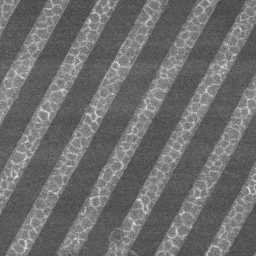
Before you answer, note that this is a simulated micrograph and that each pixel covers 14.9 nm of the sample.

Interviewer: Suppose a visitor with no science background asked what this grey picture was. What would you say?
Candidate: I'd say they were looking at parallel lines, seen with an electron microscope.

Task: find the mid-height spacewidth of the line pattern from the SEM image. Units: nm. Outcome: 274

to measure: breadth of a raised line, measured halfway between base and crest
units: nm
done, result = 378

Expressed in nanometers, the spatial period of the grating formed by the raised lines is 648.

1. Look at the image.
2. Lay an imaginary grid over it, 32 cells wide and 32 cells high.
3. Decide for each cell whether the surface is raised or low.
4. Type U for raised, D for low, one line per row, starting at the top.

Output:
DDUUUUDDUUUUDDDUUUDDDUUUDDDUUUUD
DDUUUDDDUUUDDDUUUUDDUUUUDDDUUUDD
DUUUUDDUUUUDDUUUUDDDUUUDDDUUUDDD
UUUUDDDUUUDDDUUUUDDUUUUDDUUUUDDD
UUUUDDUUUUDDUUUUDDDUUUDDDUUUDDDU
UUUDDDUUUDDDUUUDDDUUUUDDUUUUDDUU
UUDDDUUUUDDUUUUDDUUUUDDDUUUDDDUU
UUDDUUUUDDDUUUDDDUUUUDDUUUUDDUUU
UDDDUUUUDDUUUUDDUUUUDDDUUUDDDUUU
UDDUUUUDDDUUUDDDUUUDDDUUUUDDUUUU
DDDUUUDDDUUUUDDUUUUDDUUUUDDDUUUD
DDUUUUDDDUUUDDDUUUDDDUUUDDDUUUUD
DDUUUDDDUUUUDDUUUUDDUUUUDDDUUUDD
DUUUUDDUUUUDDUUUUDDDUUUDDDUUUUDD
DUUUDDDUUUDDDUUUUDDUUUUDDUUUUDDD
UUUUDDUUUUDDUUUUDDDUUUDDDUUUDDDU
UUUDDDUUUDDDUUUUDDUUUUDDUUUUDDDU
UUUDDUUUUDDUUUUDDDUUUDDDUUUDDDUU
UUDDDUUUDDDUUUDDDUUUUDDUUUUDDUUU
UDDDUUUUDDUUUUDDUUUUDDDUUUDDDUUU
UDDUUUUDDDUUUDDDUUUDDDUUUUDDUUUU
DDDUUUUDDUUUUDDUUUUDDDUUUDDDUUUD
DDUUUUDDDUUUDDDUUUDDDUUUUDDUUUUD
DDUUUDDDUUUUDDUUUUDDUUUUDDDUUUDD
DUUUUDDUUUUDDDUUUDDDUUUDDDUUUUDD
DUUUDDDUUUDDDUUUUDDUUUUDDDUUUDDD
UUUUDDUUUUDDDUUUDDDUUUDDDUUUUDDU
UUUDDDUUUDDDUUUUDDUUUUDDUUUUDDDU
UUUDDUUUUDDUUUUDDDUUUDDDUUUUDDUU
UUDDDUUUDDDUUUUDDUUUUDDUUUUDDDUU
UDDDUUUUDDUUUUDDUUUUDDDUUUDDDUUU
UDDDUUUDDDUUUDDDUUUUDDUUUUDDUUUU